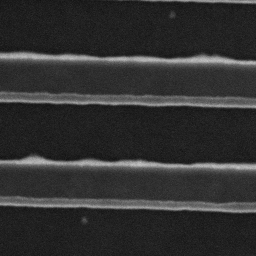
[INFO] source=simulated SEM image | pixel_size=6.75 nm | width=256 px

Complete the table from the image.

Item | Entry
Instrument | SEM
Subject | lines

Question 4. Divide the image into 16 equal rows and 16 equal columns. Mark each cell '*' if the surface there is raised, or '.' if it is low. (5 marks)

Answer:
................
................
................
................
****************
****************
.......*********
................
................
................
****************
****************
****************
................
................
................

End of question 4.